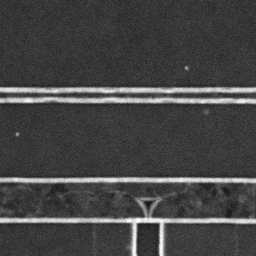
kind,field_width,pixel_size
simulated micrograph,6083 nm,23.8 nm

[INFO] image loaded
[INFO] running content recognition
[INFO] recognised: wiring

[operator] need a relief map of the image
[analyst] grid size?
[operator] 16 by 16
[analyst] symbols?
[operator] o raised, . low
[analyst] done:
................
................
................
................
................
................
................
................
................
................
................
oooooooooooooooo
oooooooooooooooo
oooooooooooooooo
................
................